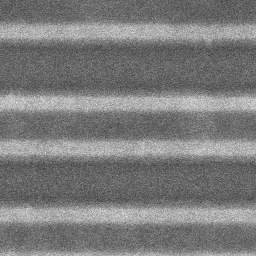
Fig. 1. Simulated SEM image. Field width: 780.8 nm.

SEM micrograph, one or a few lines or trenches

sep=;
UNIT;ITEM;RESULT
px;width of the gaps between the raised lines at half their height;69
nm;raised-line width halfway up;139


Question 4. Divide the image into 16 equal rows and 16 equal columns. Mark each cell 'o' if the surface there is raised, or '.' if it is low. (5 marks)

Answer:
oooooooooooooooo
oooooooooooooooo
................
................
................
................
ooo.oooooooooooo
oooooooooooooooo
oooooooooooooooo
................
................
................
................
ooooooooooo.....
oooooooooooooooo
oooooooooooooooo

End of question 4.